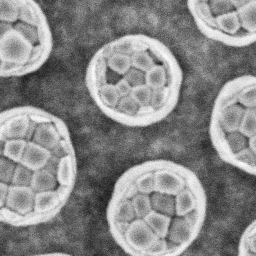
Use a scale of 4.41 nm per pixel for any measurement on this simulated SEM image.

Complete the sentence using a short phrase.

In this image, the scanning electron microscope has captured raised bodies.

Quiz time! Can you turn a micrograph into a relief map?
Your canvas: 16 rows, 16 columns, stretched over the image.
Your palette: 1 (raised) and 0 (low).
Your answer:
1100000000001111
1110000000000111
1110000110000011
1110001111000000
1100001111100000
0000001111100011
0000001111100011
1110000010000111
1111000000000111
1111100000000011
1111100001100001
1111100011110000
1111000111110000
1110000111111000
0000000111110001
0000000011110001